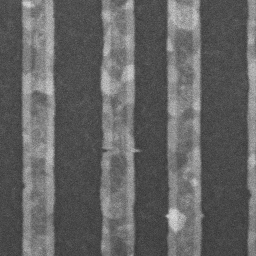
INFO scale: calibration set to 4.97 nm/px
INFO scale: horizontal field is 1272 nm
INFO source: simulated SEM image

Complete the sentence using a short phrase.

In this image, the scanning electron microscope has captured one or a few lines or trenches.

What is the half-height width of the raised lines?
121 nanometres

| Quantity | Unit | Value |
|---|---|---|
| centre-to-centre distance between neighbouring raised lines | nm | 363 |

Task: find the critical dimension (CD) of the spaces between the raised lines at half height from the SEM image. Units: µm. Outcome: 0.271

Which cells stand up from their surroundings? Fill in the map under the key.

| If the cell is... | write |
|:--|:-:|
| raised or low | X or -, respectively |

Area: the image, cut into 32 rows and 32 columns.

---XXX-------XXX------XXX------X
---XXX-------XXX------XXX------X
---XXX-------XXX------XX-------X
---XXX-------XXX------XX-------X
---XXX-------XXX-----XXXX------X
---XXX-------XXX-----XXXX------X
---XXX-------XXX-----XXXX------X
---XXX-------XXX-----XXXX------X
---XXX-------XXX-----XXXX-------
---XXX-------XXX------XXX-------
---XXX-------XXX------XXX-------
---XXX-------XXX------XXX-------
---XXX-------XXX------XXX-------
---XXX-------XXX------XXX-------
---XXX--------XX------XXX-------
---XXX--------XX------XXX------X
---XXX--------XX------XXX-------
---XXX--------XX------XXX-------
---XXX--------XX------XXX------X
---XXX-------XXX------XXX------X
---XXX-------XXX------XXX------X
---XXX-------XXX------XXX------X
---XXX-------XXX------XXX------X
----XX-------XXX------XXX-------
---XXX-------XXX------XXX-------
---XXX-------XXX------XXX-------
---XXX-------XXX------XXX-------
---XXX-------XXX-----XXXX-------
---XXX-------XXX------XXX-------
---XXX-------XXX-----XXXX-------
---XXX-------XXX-----XXXX-------
---XXX-------XXX------XXX-------